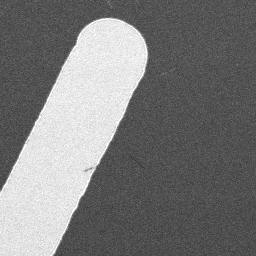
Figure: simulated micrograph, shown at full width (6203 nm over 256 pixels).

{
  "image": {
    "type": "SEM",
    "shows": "one or a few lines or trenches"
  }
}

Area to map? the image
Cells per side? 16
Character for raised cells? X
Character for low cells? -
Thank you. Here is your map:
XXXXXXXXXXXXXXXX
XXXXXX--XXXXXXXX
XXXXX----XXXXXXX
XXXX-----XXXXXXX
XXXX-----XXXXXXX
XXX-----XXXXXXXX
XXX-----XXXXXXXX
XX-----XXXXXXXXX
XX-----XXXXXXXXX
X-----XXXXXXXXXX
X-----XXXXXXXXXX
-----XXXXXXXXXXX
-----XXXXXXXXXXX
----XXXXXXXXXXXX
----XXXXXXXXXXXX
---XXXXXXXXXXXXX